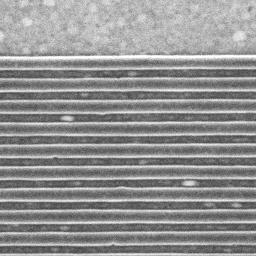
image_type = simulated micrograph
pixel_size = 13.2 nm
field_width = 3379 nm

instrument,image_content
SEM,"parallel lines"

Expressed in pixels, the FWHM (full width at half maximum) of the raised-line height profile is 12.5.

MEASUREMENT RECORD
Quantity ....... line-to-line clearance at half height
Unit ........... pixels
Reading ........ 9.12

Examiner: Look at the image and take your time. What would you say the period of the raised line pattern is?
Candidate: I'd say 290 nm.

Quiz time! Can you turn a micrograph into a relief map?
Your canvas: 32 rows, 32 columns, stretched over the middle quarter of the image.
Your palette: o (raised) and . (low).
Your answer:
oooooooooooooooooooooooooooooooo
................................
................................
................................
oooooooooooooooooooooooooooooooo
oooooooooooooooooooooooooooooooo
oooooo........oo......oooooooooo
................................
................................
oooooooooooooooooooooooooooooooo
oooooooooooooooooooooooooooooooo
oooooooooooooooooooooooooooooooo
................................
................................
................................
oooooooooooooooooooooooooooooooo
oooooooooooooooooooooooooooooooo
oooooooooooooooooooooooooooooooo
................................
................................
oooooooooooooooooooooooooooooooo
oooooooooooooooooooooooooooooooo
oooooooooooooooooooooooooooooooo
................................
................................
................................
oooooooooooooooooooooooooooooooo
oooooooooooooooooooooooooooooooo
oooooooooooooooooooooooooooooooo
................................
................................
oooooooooooooooooooooooooooooooo